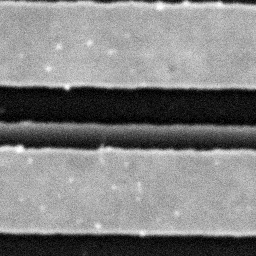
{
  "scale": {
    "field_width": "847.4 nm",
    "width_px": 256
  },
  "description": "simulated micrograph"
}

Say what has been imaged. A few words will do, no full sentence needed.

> lines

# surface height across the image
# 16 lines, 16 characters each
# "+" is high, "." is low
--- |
++++++++++++++++
++++++++++++++++
++++++++++++++++
++++++++++++++++
++++++++++++++++
...........+++.+
................
................
++++++++++++++++
++++++++++++++++
++++++++++++++++
++++++++++++++++
++++++++++++++++
++++++++++++++++
++++++++++++++++
................